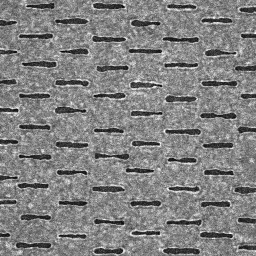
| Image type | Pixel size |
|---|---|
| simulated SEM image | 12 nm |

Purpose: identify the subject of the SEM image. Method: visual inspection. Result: a regular array of holes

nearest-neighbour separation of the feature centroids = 350 nm